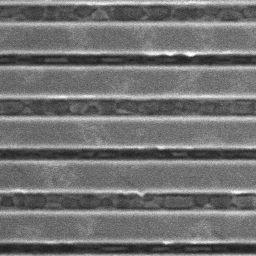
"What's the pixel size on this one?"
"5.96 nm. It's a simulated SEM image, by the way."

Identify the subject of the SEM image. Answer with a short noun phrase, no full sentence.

parallel lines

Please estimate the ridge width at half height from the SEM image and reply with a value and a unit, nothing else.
192 nm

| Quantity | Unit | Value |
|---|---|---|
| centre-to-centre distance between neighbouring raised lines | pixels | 47.2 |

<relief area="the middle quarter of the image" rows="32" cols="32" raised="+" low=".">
........++.....+++............+.
++++++++++++++++++++++++++++++++
++++++++++++++++++++++++++++++++
++++++++++++++++++++++++++++++++
++++++++++++++++++++++++++++++++
++++++++++++++++++++++++++++++++
++++++++++++++++++++++++++++++++
++++++++++++++++++++++++++++++++
.......++.++...+++++++.+++......
................................
................................
................................
................................
++++++++++++++++++++++++++++++++
++++++++++++++++++++++++++++++++
++++++++++++++++++++++++++++++++
++++++++++++++++++++++++++++++++
++++++++++++++++++++++++++++++++
++++++++++++++++++++++++++++++++
++++++++++++++++++++++++++++++++
++++++++++++++++++++++++++++++++
................................
................................
................................
++++++++++++++++++++++++++++++++
++++++++++++++++++++++++++++++++
++++++++++++++++++++++++++++++++
++++++++++++++++++++++++++++++++
++++++++++++++++++++++++++++++++
++++++++++++++++++++++++++++++++
++++++++++++++++++++++++++++++++
++++++++++++++++++++++++++++++++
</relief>